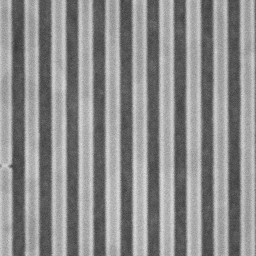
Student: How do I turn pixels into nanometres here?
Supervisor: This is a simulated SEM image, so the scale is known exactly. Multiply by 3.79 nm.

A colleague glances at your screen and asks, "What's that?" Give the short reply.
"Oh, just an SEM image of parallel lines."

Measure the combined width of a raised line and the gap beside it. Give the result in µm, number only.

0.102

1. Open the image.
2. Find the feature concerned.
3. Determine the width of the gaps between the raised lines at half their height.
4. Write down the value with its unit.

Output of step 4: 59.2 nm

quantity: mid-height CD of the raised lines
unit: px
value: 11.2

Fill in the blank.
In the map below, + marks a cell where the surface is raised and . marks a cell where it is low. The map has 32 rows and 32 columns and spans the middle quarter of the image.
....+++....++.....++....+++....+
....+++....++.....++....+++....+
....+++....++.....++....+++....+
....+++....++.....++....+++....+
....+++....++.....++....+++....+
....+++....++.....++....+++....+
....+++....++.....++....+++....+
....+++....+++....++....+++....+
....+++....+++....++....+++....+
....+++....+++....++....+++....+
....+++....+++....++....+++....+
....+++....+++....++....+++....+
....+++....+++....++....+++....+
....+++....+++....++....+++....+
....+++....+++....++....+++....+
....+++....+++....++....+++....+
....+++....+++....++....+++....+
....+++....+++....++....+++....+
....+++....+++....++....+++....+
....+++....+++....++....+++....+
....+++....+++....++....+++....+
....+++....+++....++....+++....+
....+++....+++....++....+++....+
....+++....+++....++....+++....+
....+++....+++....++....+++....+
....+++....+++....++....+++....+
....+++....+++....++....+++....+
....+++....+++....++....+++....+
....+++....+++....++....+++....+
....+++....+++....++....+++....+
....+++....+++....++....+++....+
....+++....+++....++....+++....+